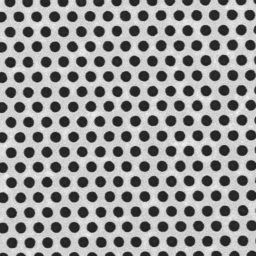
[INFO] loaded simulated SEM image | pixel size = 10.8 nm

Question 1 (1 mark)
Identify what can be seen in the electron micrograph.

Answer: a regular array of holes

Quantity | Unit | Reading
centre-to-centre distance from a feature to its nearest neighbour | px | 17.3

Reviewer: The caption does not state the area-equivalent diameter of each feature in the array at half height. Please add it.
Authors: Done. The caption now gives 117 nanometres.